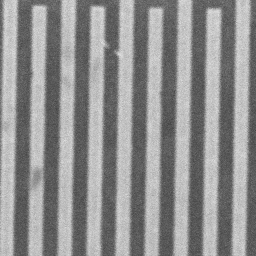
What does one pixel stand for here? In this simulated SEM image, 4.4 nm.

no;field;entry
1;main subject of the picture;parallel lines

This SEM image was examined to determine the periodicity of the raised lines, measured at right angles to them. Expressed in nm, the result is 128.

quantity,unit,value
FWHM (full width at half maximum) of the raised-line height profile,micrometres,0.0572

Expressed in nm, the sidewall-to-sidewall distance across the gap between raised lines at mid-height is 69.8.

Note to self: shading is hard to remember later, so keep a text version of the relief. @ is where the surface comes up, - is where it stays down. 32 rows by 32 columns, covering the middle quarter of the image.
@@@----@@@----@@@----@@@-----@@@
@@-----@@@----@@@----@@@-----@@@
@@----@@@@----@@@----@@@-----@@-
@@-----@@@----@@@----@@@----@@@-
@@-----@@@----@@@----@@@----@@@-
@@----@@@@----@@@----@@@----@@@-
@@----@@@@----@@@----@@@----@@@-
@@-----@@@----@@@----@@@----@@@-
@@-----@@@----@@@----@@@----@@@-
@@-----@@@----@@@----@@@----@@@-
@@-----@@@----@@@----@@@----@@@-
@@-----@@@----@@@----@@@----@@@-
@@-----@@-----@@@----@@@----@@@-
@@----@@@-----@@@----@@@----@@@-
@@----@@@-----@@@----@@@----@@@-
@@----@@@-----@@@----@@@----@@@-
@@----@@@-----@@@----@@@----@@@-
@@----@@@-----@@@----@@@----@@@-
@@----@@@-----@@@----@@@----@@@-
@@----@@@-----@@@----@@@----@@@-
@@----@@@-----@@@----@@@----@@@-
@@----@@@-----@@@----@@@----@@@-
@@----@@@-----@@@----@@@----@@@-
@@----@@@-----@@@----@@@----@@@-
@@----@@@----@@@@----@@@----@@@-
@@----@@@----@@@-----@@@----@@@-
@@----@@@----@@@-----@@@----@@@-
@@----@@@----@@@-----@@@----@@@-
@@----@@@----@@@-----@@@----@@@-
@@----@@@----@@@-----@@@----@@@-
@@----@@@----@@@-----@@@----@@@-
@@----@@@----@@@-----@@@----@@@-